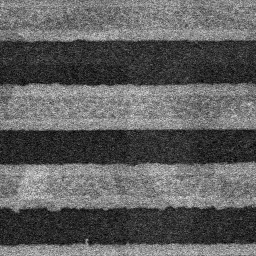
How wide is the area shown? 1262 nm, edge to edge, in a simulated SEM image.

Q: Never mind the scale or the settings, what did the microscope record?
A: one or a few lines or trenches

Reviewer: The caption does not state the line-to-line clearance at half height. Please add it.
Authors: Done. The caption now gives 0.24 micrometres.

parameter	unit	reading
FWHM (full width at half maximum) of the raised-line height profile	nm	162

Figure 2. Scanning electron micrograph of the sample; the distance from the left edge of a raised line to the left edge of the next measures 409 nm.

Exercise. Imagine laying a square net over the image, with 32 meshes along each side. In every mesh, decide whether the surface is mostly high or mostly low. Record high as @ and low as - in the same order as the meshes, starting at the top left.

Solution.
@@@@@@@@@@@@@@@@@@@@@@@@@@@@@@@@
@@@@@@@@@@@@@@@@@@@@@@@@@@@@@@@@
@@@@@@@@@@@@@@@@@@@@@@@@@@@@@@@@
@@@@@@@@@@@@@@@@@@@@@@@@@@@@@@@@
--------------------------------
--------------------------------
--------------------------------
--------------------------------
--------------------------------
--------------------------------
--------------------------------
@@@@@@@@@@@@@@@@@@@@@@@@@@@@@@@@
@@@@@@@@@@@@@@@@@@@@@@@@@@@@@@@@
@@@@@@@@@@@@@@@@@@@@@@@@@@@@@@@@
@@@@@@@@@@@@@@@@@@@@@@@@@@@@@@@@
@-------@@--------@-------------
--------------------------------
--------------------------------
--------------------------------
--------------------------------
--------------------------------
@@@@@@@@@@@@@@@@@@@@@@@@@@@@@@@@
@@@@@@@@@@@@@@@@@@@@@@@@@@@@@@@@
@@@@@@@@@@@@@@@@@@@@@@@@@@@@@@@@
@@@@@@@@@@@@@@@@@@@@@@@@@@@@@@@@
--------------------------------
--------------------------------
--------------------------------
--------------------------------
--------------------------------
--------------------------------
@@@@@@@--@@@@@@@@@@@@@@@@@@@@@@@